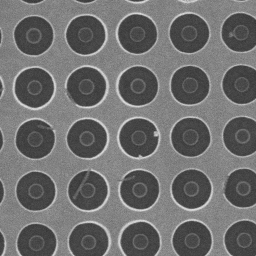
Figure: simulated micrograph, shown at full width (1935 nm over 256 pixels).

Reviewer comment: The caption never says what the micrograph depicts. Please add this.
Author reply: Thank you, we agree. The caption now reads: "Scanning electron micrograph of an array of small figures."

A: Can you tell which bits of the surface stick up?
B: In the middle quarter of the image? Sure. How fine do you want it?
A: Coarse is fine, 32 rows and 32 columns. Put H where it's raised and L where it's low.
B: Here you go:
HHHHHLHHHHHHHHHHHHHLHHHHHHHHHHHL
HHHLLLLLLHHHHHHHLLLLLLHHHHHHLLLL
HHLLLLLLLLHHHHLLLLLLLLLHHHHLLLLL
HLLLLLLLLLHHHHLLLLLLLLLHHHHLLLLL
HLLLHHHLLLLHHLLLLHHHLLLHHHHLLLHH
LLLLHHHLLLLHHLLLLHHHLLLLHHHLLLHH
HLLLHHHLLLLHHLLLLHHHLLLHHHHLLLHH
HLLLLLLLLLLHHHLLLLLLLLLHHHHLLLLL
HHLLLLLLLLHHHHLLLLLLLLLHHHHHLLLL
HHHLLLLLLHHHHHHLLLLLLLHHHHHHHLLL
HHHHLLLLHHHHHHHHHLLHHHHHHHHHHHHH
HHHHHHHHHHHHHHHHHHHHHHHHHHHHHHHH
HHHHHHHHHHHHHHHHHHHHHHHHHHHHHHHH
HHHHHHHHHHHHHHHHHLLLHHHHHHHHHHLL
HHHLLLLLLHHHHHHLLLLLLLHHHHHHLLLL
HHLLLLLLLLHHHHLLLLLLLLLHHHHLLLLL
HLLLLLLLLLLHHHLLLLLLLLLHHHHLLLLL
HLLLLHHLLLLHHHLLLHHHLLLLHHHLLLHH
HLLLHHHLLLLHHLLLLHHHLLLLHHHLLLHH
HLLLHHHLLLLHHHLLLHHHLLLLHHHLLLHH
HLLLLLLLLLLHHHLLLLLLLLLHHHHLLLLL
HHLLLLLLLLHHHHHLLLLLLLLHHHHHLLLL
HHHLLLLLLHHHHHHHLLLLLLHHHHHHHLLL
HHHHLLLLHHHHHHHHHHLLHHHHHHHHHHHH
HHHHHHHHHHHHHHHHHHHHHHHHHHHHHHHH
HHHHHHHHHHHHHHHHHHHHHHHHHHHHHHHH
HHHHHHHHHHHHHHHHHHLHHHHHHHHHHHHL
HHHLLLLLLHHHHHHHLLLLLLHHHHHHHLLL
HHLLLLLLLLHHHHHLLLLLLLLHHHHHLLLL
HLLLLLLLLLLHHHHLLLLLLLLLHHHLLLLL
HLLLHHHLLLLHHHLLLLHHLLLLHHHLLLHH
HLLLHHHHLLLHHHLLLHHHLLLLHHHLLLHH